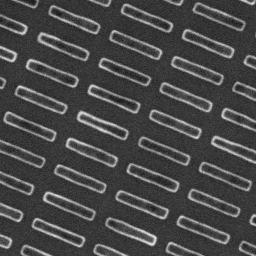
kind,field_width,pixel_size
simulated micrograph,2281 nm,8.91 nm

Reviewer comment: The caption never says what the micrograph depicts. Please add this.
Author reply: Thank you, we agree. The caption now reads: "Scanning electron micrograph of groups of lines, slits or small figures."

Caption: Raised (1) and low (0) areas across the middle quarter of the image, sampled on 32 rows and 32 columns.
00000000011111100000000000011111
00000000000111111000000000000011
10000000000001111111000000000000
11100000000000001111100000000000
11100000000000000011100000000000
00000001000000000000000011100000
00000011110000000000000011111000
00000001111110000000000001111111
00000000011111100000000000001111
00000000000011111100000000000011
00000000000000111110000000000000
00000000000000001100000000000000
00001000000000000000001110000000
00001111000000000000001111100000
00000111110000000000000111111100
00000001111110000000000000111111
00000000001111100000000000001111
00000000000011110000000000000001
00000000000000100001000000000000
01110000000000000001111000000000
01111110000000000001111110000000
00011111100000000000011111110000
00000111111000000000000011111100
00000001111110000000000000111110
00000000001110000000000000000110
00000000000000001110000000000000
11000000000000001111100000000000
11110000000000000111111100000000
11111110000000000001111111000000
00011111100000000000001111110000
00000111110000000000000011110000
00000000110000000000000000110000